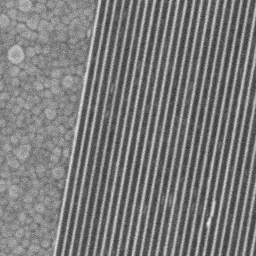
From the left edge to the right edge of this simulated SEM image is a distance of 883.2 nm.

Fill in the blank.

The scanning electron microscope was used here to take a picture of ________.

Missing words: parallel lines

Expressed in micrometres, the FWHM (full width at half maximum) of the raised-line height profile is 0.0068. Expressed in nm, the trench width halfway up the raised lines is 20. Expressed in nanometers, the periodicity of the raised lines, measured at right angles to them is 26.7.